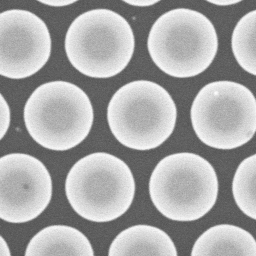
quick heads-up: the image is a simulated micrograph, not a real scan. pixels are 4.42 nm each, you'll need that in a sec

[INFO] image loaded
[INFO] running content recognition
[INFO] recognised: an array of small figures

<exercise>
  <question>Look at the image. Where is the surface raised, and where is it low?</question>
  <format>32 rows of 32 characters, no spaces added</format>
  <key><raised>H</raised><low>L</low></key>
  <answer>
LLLLLLHHHLLLLLLLHHHLLLLLLLLHHLLL
HHHHLLLLLLLHHHLLLLLLLHHHHLLLLLLH
HHHHHLLLLHHHHHHHLLLLHHHHHHLLLLHH
HHHHHHLLLHHHHHHHLLLHHHHHHHHLLHHH
HHHHHHLLHHHHHHHHHLLHHHHHHHHLLHHH
HHHHHHLLHHHHHHHHHLHHHHHHHHHLLHHH
HHHHHHLLHHHHHHHHHLLHHHHHHHHLLHHH
HHHHHHLLLHHHHHHHLLLHHHHHHHHLLLHH
HHHHHLLLLHHHHHHLLLLLHHHHHHLLLLHH
LHHHLLLLLLLHHHLLLLLLLLHHLLLLLLLL
LLLLLHHHHLLLLLLLHHHLLLLLLLHHHHLL
LLLLHHHHHHLLLLLHHHHHHLLLLHHHHHHL
HLLHHHHHHHHLLLHHHHHHHHLLHHHHHHHH
HLLHHHHHHHHHLHHHHHHHHHLLHHHHHHHH
HLLHHHHHHHHHLHHHHHHHHHLLHHHHHHHH
HLLHHHHHHHHLLLHHHHHHHHLLHHHHHHHH
HLLLHHHHHHHLLLHHHHHHHLLLHHHHHHHH
LLLLHHHHHHLLLLLHHHHHHLLLLHHHHHHL
LLLLLLHHHLLLLLLLHHHLLLLLLLLHHLLL
LHHHLLLLLLLHHHLLLLLLLHHHHLLLLLLL
HHHHHLLLLHHHHHHHLLLLHHHHHHLLLLHH
HHHHHHLLLHHHHHHHLLLHHHHHHHHLLHHH
HHHHHHLLHHHHHHHHHLLHHHHHHHHLLHHH
HHHHHHLLHHHHHHHHHLLHHHHHHHHLLHHH
HHHHHHLLHHHHHHHHHLLHHHHHHHHLLHHH
HHHHHHLLLHHHHHHHLLLHHHHHHHHLLLHH
HHHHHLLLLLHHHHHHLLLLHHHHHHLLLLHH
LHHHLLLLLLLHHHLLLLLLLLHHLLLLLLLL
LLLLLLHHHLLLLLLLHHHLLLLLLLHHHHLL
LLLLHHHHHHHLLLLHHHHHHLLLLHHHHHHL
HLLLHHHHHHHLLLHHHHHHHHLLHHHHHHHH
HLLHHHHHHHHHLLHHHHHHHHLLHHHHHHHH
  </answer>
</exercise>